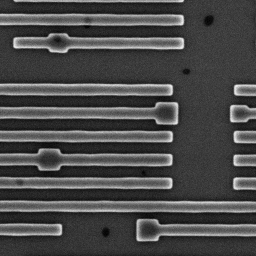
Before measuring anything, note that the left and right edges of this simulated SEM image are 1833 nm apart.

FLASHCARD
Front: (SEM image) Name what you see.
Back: wiring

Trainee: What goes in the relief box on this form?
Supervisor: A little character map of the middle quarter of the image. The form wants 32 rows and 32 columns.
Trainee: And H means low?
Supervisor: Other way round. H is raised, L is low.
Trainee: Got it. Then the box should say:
LLLLLLLLLLLLLLLLLLLLLLLLLLLLLLLL
LLLLLLLLLLLLLLLLLLLLLLLLLLLLLLLL
LLLLLLLLLLLLLLLLLLLLLLLLLLLLLLLL
LLLLLLLLLLLLLLLLLLLLLLLLLLLLLLLL
LLLLLLLLLLLLLLLLLLLLLLLLLLLLLLLL
HHHHHHHHHHHHHHHHHHHHHHHHHHHLLLLL
HHHHHHHHHHHHHHHHHHHHHHHHHHHLLLLL
HHHHHHHHHHHHHHHHHHHHHHHHHHHLLLLL
LLLLLLLLLLLLLLLLLLLLLLLLLLLLLLLL
LLLLLLLLLLLLLLLLLLLLLLLLLLLLLLLL
LLLLLLLLLLLLLLLLLLLLLLLHHHHHLLLL
HHHHHHHHHHHHHHHHHHHHHHHHHHHHLLLL
HHHHHHHHHHHHHHHHHHHHHHHHHHHHLLLL
HHHHHHHLHHHHHHHHHHHHHHHHHHHHLLLL
LLLLLLLLLLLLLLLLLLLLLLLHHHHHLLLL
LLLLLLLLLLLLLLLLLLLLLLLLLLLLLLLL
LLLLLLLLLLLLLLLLLLLLLLLLLLLLLLLL
HHHHHHHHHHHHHHHHHHHHHHHHHHHLLLLL
HHHHHHHHHHHHHHHHHHHHHHHHHHHLLLLL
LLLLLLLLLLLLLLLLLLLLLLLLLLLLLLLL
LLLLLLLLLLLLLLLLLLLLLLLLLLLLLLLL
LLLLLLLLLLLLLLLLLLLLLLLLLLLLLLLL
LLLLLLLLLLLLLLLLLLLLLLLLLLLLLLLL
HHHHHHHHHHHHHHHHHHHHHHHHHHHLLLLL
HHHHHHHHHHHHHHHHHHHHHHHHHHHLLLLL
LLLLLLLLLLLLLLLLLLLLLLLLLLLLLLLL
LLLLLLLLLLLLLLLLLLLLLLLLLLLLLLLL
LLLLLLLLLLLLLLLLLLLLLLLLLLLLLLLL
LLLLLLLLLLLLLLLLLLLLLLLLLLLLLLLL
HHHHHHHHHHHHHHHHHHHHHHHHHHHLLLLL
HHHHHHHHHHHHHHHHHHHHHHHHHHHLLLLL
LLLLLLLLLLLLLLLLLLLLLLLLLLLLLLLL